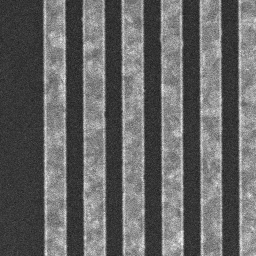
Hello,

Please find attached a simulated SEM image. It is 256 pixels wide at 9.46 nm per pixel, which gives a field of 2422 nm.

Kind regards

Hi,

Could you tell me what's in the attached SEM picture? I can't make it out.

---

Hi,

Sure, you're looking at parallel lines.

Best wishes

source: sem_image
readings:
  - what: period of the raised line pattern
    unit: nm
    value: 369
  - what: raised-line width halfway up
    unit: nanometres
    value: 178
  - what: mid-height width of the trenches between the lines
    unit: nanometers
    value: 187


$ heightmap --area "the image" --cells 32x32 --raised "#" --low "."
......##...##..###..###..##...##
......##...##..###..###..##...##
......##..###..###..###..##...##
......##...##..###..###..##...##
......##...##..###..###..##...##
......##...##..###..###..##...##
......##...##..###..###..##...##
......##...##..###..###..##...##
......##...##..###..###..##...##
......##...##..###..###..##...##
......##...##..###..###..##...##
......##...##..###..###..###..##
......##...##...##..###..###..##
......##...##...##..###..###..##
......##...##...##..###..###..##
......##...##...##..###..###..##
......##...##...##..###..###..##
......##...##...##..###..###..##
......##...##...##..###..###..##
......##...##...##..###..###..##
......##...##...##..###..###..##
......##...##...##..###..###..##
......##...##...##..###..###..##
......##...##...##..###..###..##
......##...##...##..###..###..##
......##...##...##..###..###..##
......##...##...##..###..###..##
......##...##...##..###..###..##
......##...##...##..###..###..##
......##...##...##..###..###..##
......##...##...##..###..###..##
......##...##...##..###..###..##